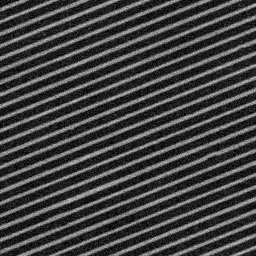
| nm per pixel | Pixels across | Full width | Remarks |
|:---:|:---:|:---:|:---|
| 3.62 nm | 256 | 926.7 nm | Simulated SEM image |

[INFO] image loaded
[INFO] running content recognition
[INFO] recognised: parallel lines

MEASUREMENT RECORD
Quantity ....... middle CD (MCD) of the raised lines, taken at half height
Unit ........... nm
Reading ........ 9.7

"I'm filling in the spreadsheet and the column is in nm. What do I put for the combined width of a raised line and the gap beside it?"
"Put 40.8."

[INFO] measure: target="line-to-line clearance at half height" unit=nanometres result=29